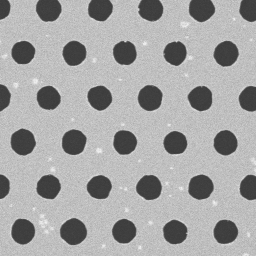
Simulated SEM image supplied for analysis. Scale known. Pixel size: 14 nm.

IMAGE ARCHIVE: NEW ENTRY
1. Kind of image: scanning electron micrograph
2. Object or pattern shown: a regular array of holes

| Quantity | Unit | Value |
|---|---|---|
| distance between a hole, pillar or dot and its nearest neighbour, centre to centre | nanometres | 709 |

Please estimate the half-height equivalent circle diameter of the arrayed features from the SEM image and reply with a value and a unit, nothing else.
345 nanometers